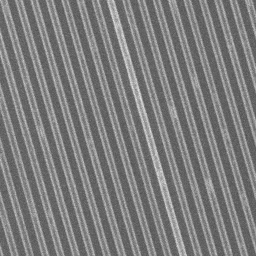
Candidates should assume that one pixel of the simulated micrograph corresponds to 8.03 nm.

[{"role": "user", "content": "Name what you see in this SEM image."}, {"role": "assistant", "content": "parallel lines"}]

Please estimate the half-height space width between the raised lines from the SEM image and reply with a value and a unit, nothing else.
0.0715 microns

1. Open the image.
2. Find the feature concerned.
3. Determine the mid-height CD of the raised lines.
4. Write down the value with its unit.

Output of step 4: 47.3 nanometres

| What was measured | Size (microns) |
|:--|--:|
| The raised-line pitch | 0.118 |